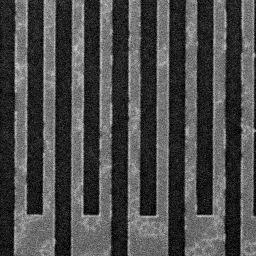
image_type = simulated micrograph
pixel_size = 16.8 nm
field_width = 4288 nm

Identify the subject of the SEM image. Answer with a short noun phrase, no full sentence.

parallel lines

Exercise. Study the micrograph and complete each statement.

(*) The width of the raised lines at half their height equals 0.18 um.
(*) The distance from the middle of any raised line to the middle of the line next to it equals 474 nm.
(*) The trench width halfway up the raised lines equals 299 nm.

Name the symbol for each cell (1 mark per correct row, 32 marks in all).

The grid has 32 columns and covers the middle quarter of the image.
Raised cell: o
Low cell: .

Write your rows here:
..ooo....ooo....ooo....ooo.....o
..ooo....ooo....ooo....ooo.....o
..ooo....ooo....ooo....ooo.....o
..ooo....ooo....ooo....ooo.....o
..ooo....ooo....ooo....ooo.....o
..ooo....ooo....ooo....ooo.....o
..ooo....ooo....ooo....ooo.....o
..ooo....ooo....ooo....ooo.....o
..ooo....ooo....ooo....ooo.....o
..ooo....ooo....ooo....ooo.....o
..ooo....ooo....ooo....ooo.....o
..ooo....ooo....ooo....ooo.....o
..ooo....ooo....ooo....ooo.....o
..ooo....ooo....ooo....ooo.....o
..ooo....ooo....ooo....ooo.....o
..ooo....ooo....ooo....ooo.....o
..ooo....ooo....ooo....ooo.....o
..ooo....ooo....ooo....ooo.....o
..ooo....ooo....ooo....ooo.....o
..ooo....ooo....ooo....ooo....oo
..ooo....ooo....ooo....ooo....oo
..ooo....ooo....ooo....ooo....oo
..ooo....ooo....ooo....ooo....oo
..oo.....ooo....ooo....ooo....oo
..oo.....ooo....ooo.....oo....oo
..oo.....ooo....ooo....ooo....oo
..oo.....ooo....ooo.....oo....oo
..oo.....ooo....ooo....ooo....oo
..oo.....ooo....ooo.....oo....oo
..oo.....ooo....ooo....ooo....oo
..oo.....ooo....ooo....ooo....oo
..oo.....ooo....ooo.....oo....oo